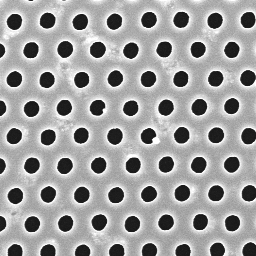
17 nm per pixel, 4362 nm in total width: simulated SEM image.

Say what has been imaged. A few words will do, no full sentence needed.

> a regular array of holes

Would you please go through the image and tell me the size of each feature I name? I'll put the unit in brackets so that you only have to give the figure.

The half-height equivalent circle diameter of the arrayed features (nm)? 276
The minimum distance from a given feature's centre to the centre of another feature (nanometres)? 554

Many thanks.